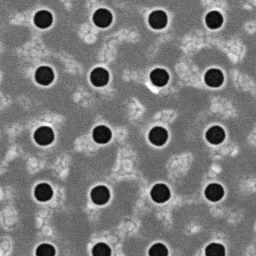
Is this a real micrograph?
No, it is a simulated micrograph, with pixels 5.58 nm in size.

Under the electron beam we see a regular array of holes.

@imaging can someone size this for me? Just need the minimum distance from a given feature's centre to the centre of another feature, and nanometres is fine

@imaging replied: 311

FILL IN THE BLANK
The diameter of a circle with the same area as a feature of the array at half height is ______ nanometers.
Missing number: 111